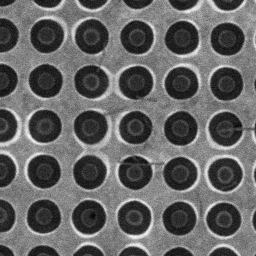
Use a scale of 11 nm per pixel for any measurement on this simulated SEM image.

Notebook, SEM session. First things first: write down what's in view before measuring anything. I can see an array of small figures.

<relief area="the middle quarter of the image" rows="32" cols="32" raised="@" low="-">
@@@@@---@@@@@@@@----@@@@@@@@---@
@@@@------@@@@@------@@@@@@-----
@@@--------@@@--------@@@@------
@@----@@----@----@@@---@@---@@@-
@@---@@@----@---@@@@---@@--@@@@-
@@@---@@----@---@@@@---@@---@@@-
@@@---------@---------@@@---@@--
@@@@-------@@@-------@@@@@------
@@@@@@---@@@@@@@----@@@@@@@-----
@@@@@@@@@@@@@@@@@@@@@@@@@@@@@@@@
@@@@@@@@@@@@@@@@@@@@@@@@@@@@@@@@
@@@@@@--@@@@@@@@@@@@@@@@@@@@@@@@
@@@@------@@@@@-----@@@@@@@-----
@@@--------@@@-------@@@@@------
@@---@@@---@@----@@---@@@---@@--
@@---@@@@---@---@@@---@@@--@@@@-
@@---@@@---@@---@@@---@@@--@@@@-
@@@---@----@@---------@@@---@@@-
@@@--------@@@-------@@@@@------
@@@@------@@@@@-----@@@@@@------
@@@@@----@@@@@@@@@@@@@@@@@@@--@@
@@@@@@@@@@@@@@@@@@@@@@@@@@@@@@@@
@@@@@----@@@@@@@@@@@@@@@@@@@@@@@
@@@@------@@@@@-----@@@@@@@@---@
@@@--------@@@@------@@@@@------
@@---@@----@@@---@----@@@-------
@@---@@@---@@---@@@---@@@--@@@@-
@@---@@@---@@---@@@---@@@--@@@@-
@@---@@@--@@@---@@@---@@@--@@@--
@@@-------@@@@-------@@@@-------
@@@@-----@@@@@@------@@@@@------
@@@@@@-@@@@@@@@@@--@@@@@@@@----@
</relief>